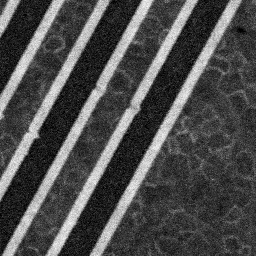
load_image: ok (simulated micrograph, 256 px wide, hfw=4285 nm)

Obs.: one or a few lines or trenches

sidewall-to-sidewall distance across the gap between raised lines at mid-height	633	nm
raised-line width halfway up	0.664	microns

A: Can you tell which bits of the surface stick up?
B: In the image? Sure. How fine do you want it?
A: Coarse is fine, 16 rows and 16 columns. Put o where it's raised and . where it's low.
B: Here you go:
o..ooo...ooo..oo
...ooo..ooo...oo
..ooo...ooo..ooo
..ooo..ooo...ooo
.ooo...ooo..oooo
.oo...ooo...oooo
ooo...ooo..ooooo
oo...ooo...ooooo
oo...oo...oooooo
o...ooo...oooooo
o..ooo...ooooooo
...ooo..oooooooo
..ooo...oooooooo
..ooo..ooooooooo
.ooo...ooooooooo
.ooo..oooooooooo